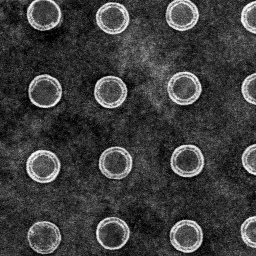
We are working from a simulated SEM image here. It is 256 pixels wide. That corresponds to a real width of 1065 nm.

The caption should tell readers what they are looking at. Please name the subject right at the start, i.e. a regular array of raised bodies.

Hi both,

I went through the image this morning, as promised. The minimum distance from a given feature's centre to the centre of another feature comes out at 299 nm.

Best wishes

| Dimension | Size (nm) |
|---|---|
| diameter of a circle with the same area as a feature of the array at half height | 131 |